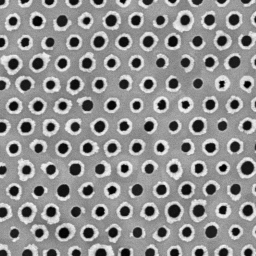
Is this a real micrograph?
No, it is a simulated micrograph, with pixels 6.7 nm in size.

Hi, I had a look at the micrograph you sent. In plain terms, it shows a regular array of holes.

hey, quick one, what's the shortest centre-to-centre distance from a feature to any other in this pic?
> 162 nm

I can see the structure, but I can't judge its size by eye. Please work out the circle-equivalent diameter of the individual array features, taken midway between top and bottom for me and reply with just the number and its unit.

68 nm